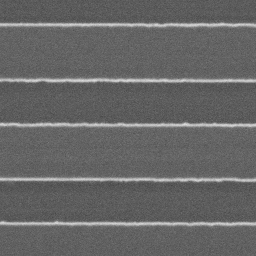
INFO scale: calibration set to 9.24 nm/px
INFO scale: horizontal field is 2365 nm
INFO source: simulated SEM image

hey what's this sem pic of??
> lines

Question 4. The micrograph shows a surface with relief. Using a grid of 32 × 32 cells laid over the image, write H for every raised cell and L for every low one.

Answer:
LLLLLLLLLLLLLLLLLLLLLLLLLLLLLLLL
LLLLLLLLLLLLLLLLLLLLLLLLLLLLLLLL
LLLLLLLLLLLLLLLLLLLLLLLLLLLLLLLL
HHHHHHHHHHHHHHHHHHHHHHHHHHHHHHHH
HHHHHHHHHHHHHHHHHHHHHHHHHHHHHHHH
HHHHHHHHHHHHHHHHHHHHHHHHHHHHHHHH
HHHHHHHHHHHHHHHHHHHHHHHHHHHHHHHH
HHHHHHHHHHHHHHHHHHHHHHHHHHHHHHHH
HHHHHHHHHHHHHHHHHHHHHHHHHHHHHHHH
HHHHHHHHHHHHHHHHHHHHHHHHHHHHHHHH
LLLLLLLLLLLLLLLLLLLLLLLLLLLLLLLL
LLLLLLLLLLLLLLLLLLLLLLLLLLLLLLLL
LLLLLLLLLLLLLLLLLLLLLLLLLLLLLLLL
LLLLLLLLLLLLLLLLLLLLLLLLLLLLLLLL
LLLLLLLLLLLLLLLLLLLLLLLLLLLLLLLL
LHLLLLLLLLLLLLLLLLLLLLLLLLLLLLLL
HHHHHHHHHHHHHHHHHHHHHHHHHHHHHHHH
HHHHHHHHHHHHHHHHHHHHHHHHHHHHHHHH
HHHHHHHHHHHHHHHHHHHHHHHHHHHHHHHH
HHHHHHHHHHHHHHHHHHHHHHHHHHHHHHHH
HHHHHHHHHHHHHHHHHHHHHHHHHHHHHHHH
HHHHHHHHHHHHHHHHHHHHHHHHHHHHHHHH
LLLLLLLLLLLLLLLLLLLLLLLLHLLLLLHL
LLLLLLLLLLLLLLLLLLLLLLLLLLLLLLLL
LLLLLLLLLLLLLLLLLLLLLLLLLLLLLLLL
LLLLLLLLLLLLLLLLLLLLLLLLLLLLLLLL
LLLLLLLLLLLLLLLLLLLLLLLLLLLLLLLL
LLLLLLLLLLLLLLLLLLLLLLLLLLLLLLLL
HHHHHHHHHHHHHHHHHHHHHHHHHHHHHHHH
HHHHHHHHHHHHHHHHHHHHHHHHHHHHHHHH
HHHHHHHHHHHHHHHHHHHHHHHHHHHHHHHH
HHHHHHHHHHHHHHHHHHHHHHHHHHHHHHHH